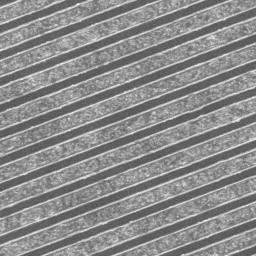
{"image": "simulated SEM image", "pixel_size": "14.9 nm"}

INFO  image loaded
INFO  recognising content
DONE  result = parallel lines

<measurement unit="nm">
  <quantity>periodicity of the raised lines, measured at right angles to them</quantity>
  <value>369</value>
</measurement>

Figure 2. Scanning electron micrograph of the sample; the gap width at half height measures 124 nanometers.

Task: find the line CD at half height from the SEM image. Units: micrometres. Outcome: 0.237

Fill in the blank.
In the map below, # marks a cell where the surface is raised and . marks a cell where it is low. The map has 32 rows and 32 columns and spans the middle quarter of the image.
#########......###########......
######......###########.......##
####......###########......#####
#......###########.......#######
....############......##########
..###########.......###########.
##########.......###########....
########......###########......#
#####.......###########......###
##.......###########......######
......###########......#########
....###########......###########
.###########.......###########..
#########.......###########.....
#######......############.....##
####.......###########......####
##......###########......#######
.....############......#########
...###########......###########.
###########......############...
#########......###########......
######......############......##
###......############......#####
#......###########......########
....############......##########
.###########.......############.
##########......############....
########......############.....#
#####......###########.......###
###......###########......######
......###########.......########
...###########.......###########